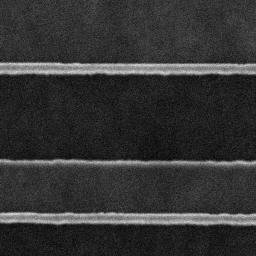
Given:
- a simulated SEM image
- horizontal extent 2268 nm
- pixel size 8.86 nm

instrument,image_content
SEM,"lines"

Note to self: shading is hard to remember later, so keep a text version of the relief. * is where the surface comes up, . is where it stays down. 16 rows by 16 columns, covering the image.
****************
****************
****************
****************
****************
................
................
................
................
................
****************
****************
****************
****************
................
................